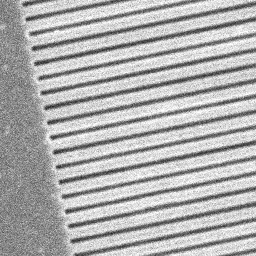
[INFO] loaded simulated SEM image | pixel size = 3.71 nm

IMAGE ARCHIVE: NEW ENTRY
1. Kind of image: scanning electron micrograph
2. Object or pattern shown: parallel lines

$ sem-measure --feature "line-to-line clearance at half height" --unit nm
19.6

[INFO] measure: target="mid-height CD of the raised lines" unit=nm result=35.5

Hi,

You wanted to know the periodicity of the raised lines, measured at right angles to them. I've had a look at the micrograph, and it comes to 0.0561 µm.